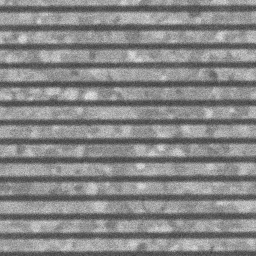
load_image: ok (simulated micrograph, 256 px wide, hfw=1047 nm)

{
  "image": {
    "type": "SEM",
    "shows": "parallel lines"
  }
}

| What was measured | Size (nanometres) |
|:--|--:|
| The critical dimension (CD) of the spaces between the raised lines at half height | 34.7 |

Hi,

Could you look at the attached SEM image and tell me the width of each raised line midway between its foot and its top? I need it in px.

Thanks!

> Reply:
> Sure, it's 10.4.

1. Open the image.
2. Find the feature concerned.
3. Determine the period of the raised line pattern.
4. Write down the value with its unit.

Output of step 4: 77.2 nm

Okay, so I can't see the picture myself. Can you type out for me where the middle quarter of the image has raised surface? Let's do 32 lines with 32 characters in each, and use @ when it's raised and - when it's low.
--------------------------------
--------------------------------
@@@@@@@@@@@@@@@@@@@@@@@@@@@@@@@@
@@@@@@@@@@@@@@@@@@@@@@@@@@@@@@@@
--------------------------------
--------------------------------
@@@@@@@@@@@@@@@@@@@@@@@@@@@@@@@@
@@@@@@@@@@@@@@@@@@@@@@@@@@@@@@@@
@@@@@@@@@@@@@@@@@@@@@----@@-----
--------------------------------
--------------------------------
@@@@@@@@@@@@@@@@@@@@@@@@@@@@@@@@
@@@@@@@@@@@@@@@@@@@@@@@@@@@@@@@@
--------------------------------
--------------------------------
--------------------------------
@@@@@@@@@@@@@@@@@@@@@@@@@@@@@@@@
@@@@@@@@@@@@@@@@@@@@@@@@@@@@@@@@
--------------------------------
--------------------------------
@@@-@@@-@@@@@@@@@--@---@@@@@@@@@
@@@@@@@@@@@@@@@@@@@@@@@@@@@@@@@@
@@@@@@@@@@@@@@@@@@@@@@@@@@@@@@@@
--------------------------------
--------------------------------
@@@@@@@@@@@@@@@@@@@@@@@@@@@@@@@@
@@@@@@@@@@@@@@@@@@@@@@@@@@@@@@@@
@@@@@@@-------------------------
--------------------------------
--------------------------------
@@@@@@@@@@@@@@@@@@@@@@@@@@@@@@@@
@@@@@@@@@@@@@@@@@@@@@@@@@@@@@@@@